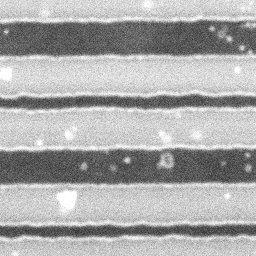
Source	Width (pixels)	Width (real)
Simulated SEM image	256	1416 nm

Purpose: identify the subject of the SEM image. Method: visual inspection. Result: lines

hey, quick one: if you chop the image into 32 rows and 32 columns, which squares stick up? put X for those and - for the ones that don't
--------------------------------
--------------------------------
XXXXXXXXXXXXXXXXXXXXXXXXXXXXXXXX
XXXXXXXXXXXXXXXXXXXXXXXXXXXXXXXX
XXXXXXXXXXXXXXXXXXXXXXXXXXXXXXXX
XXXXXXXXXXXXXXXXXXXXXXXXXXXXXXXX
XXXXXXXXXXXXXXXXXXXXXXXXXXXXXXXX
--------------------------------
--------------------------------
--------------------------------
--------------------------------
------------------------X-------
XXXXXXXXXXXXXXXXXXXXXXXXXXXXXXXX
XXXXXXXXXXXXXXXXXXXXXXXXXXXXXXXX
--------------------------------
--------------------------------
--------------------------------
--------------------------------
X-XX-XXXXXXXXXXXXXXXXXXXXXXXXXXX
XXXXXXXXXXXXXXXXXXXXXXXXXXXXXXXX
XXXXXXXXXXXXXXXXXXXXXXXXXXXXXXXX
XXXXXXXXXXXXXXXXXXXXXXXXXXXXXXXX
XXXXXXXXXXXXXXXXXXXXXXXXXXXXXXXX
--------------------------------
--------X-----------------------
--------------------------------
--------------------------------
--------------------------------
XXXXXXXXXXXXXXXXXXXXXXXXXXXXXXXX
XXXXXXXXXXXXXXXXXXXXXXXXXXXXXXXX
--------------------------------
--------------------------------